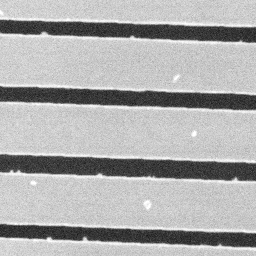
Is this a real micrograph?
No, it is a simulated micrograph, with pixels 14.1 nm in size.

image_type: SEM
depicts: lines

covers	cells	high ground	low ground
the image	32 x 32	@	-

@@@@@@@@@@@@@@@@@@@@@@@@@@@@@@@@
@@@@@@@@@@@@@@@@@@@@@@@@@@@@@@@@
------@@@@@@@@@@@@@@@@@@@@@@@@@@
--------------------------------
@@@@@---------------------------
@@@@@@@@@@@@@@@@@@@@@@@@@@@@@@@@
@@@@@@@@@@@@@@@@@@@@@@@@@@@@@@@@
@@@@@@@@@@@@@@@@@@@@@@@@@@@@@@@@
@@@@@@@@@@@@@@@@@@@@@@@@@@@@@@@@
@@@@@@@@@@@@@@@@@@@@@@@@@@@@@@@@
@@@@@@@@@@@@@@@@@@@@@@@@@@@@@@@@
-------------------------@@@@@@@
--------------------------------
@@@@@@@@@@@@@@@@@@@-------------
@@@@@@@@@@@@@@@@@@@@@@@@@@@@@@@@
@@@@@@@@@@@@@@@@@@@@@@@@@@@@@@@@
@@@@@@@@@@@@@@@@@@@@@@@@@@@@@@@@
@@@@@@@@@@@@@@@@@@@@@@@@@@@@@@@@
@@@@@@@@@@@@@@@@@@@@@@@@@@@@@@@@
--------@@@@@@@@@@@@@@@@@@@@@@@@
--------------------------------
--------------------------------
@@@@@@@@@@@@@@@@@@@@@@@@@-------
@@@@@@@@@@@@@@@@@@@@@@@@@@@@@@@@
@@@@@@@@@@@@@@@@@@@@@@@@@@@@@@@@
@@@@@@@@@@@@@@@@@@@@@@@@@@@@@@@@
@@@@@@@@@@@@@@@@@@@@@@@@@@@@@@@@
@@@@@@@@@@@@@@@@@@@@@@@@@@@@@@@@
----------------@@@@@@@@@@@@@@@@
--------------------------------
@@@@@@@@@@@@@@@@@---------------
@@@@@@@@@@@@@@@@@@@@@@@@@@@@@@@@